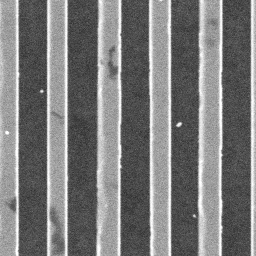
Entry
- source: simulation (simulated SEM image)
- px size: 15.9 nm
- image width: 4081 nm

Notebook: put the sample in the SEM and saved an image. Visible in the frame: lines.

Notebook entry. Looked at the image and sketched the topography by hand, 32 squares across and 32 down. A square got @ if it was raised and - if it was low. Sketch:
@@----@@----@@@----@@----@@@---@
@@----@@-----@@----@@----@@@---@
@@----@@----@@@----@@----@@@---@
@@----@@----@@@----@@----@@@---@
@@----@@----@@@----@@----@@@---@
@@----@@----@@@----@@----@@@---@
@@----@@----@@@----@@----@@@---@
@@----@@----@@@----@@----@@@---@
@@----@@----@@@----@@----@@@---@
@@----@@----@@@----@@----@@@---@
@@----@@----@@@----@@----@@@---@
@@----@@----@@@----@@----@@@---@
@@----@@----@@@----@@----@@@---@
@@----@@----@@@----@@----@@@---@
@@----@@----@@@----@@----@@@---@
@@----@@----@@@----@@----@@@---@
@@----@@----@@@----@@----@@@---@
@@----@@----@@@----@@----@@@---@
@@----@@----@@@----@@----@@@---@
@@----@@----@@@----@@----@@@---@
@@----@@----@@@----@@----@@@---@
@@----@@----@@@----@@----@@@---@
@@----@@----@@@----@@----@@@---@
@@----@@----@@@----@@----@@@---@
@@----@@----@@@----@@----@@@---@
@@----@@-----@@----@@----@@@---@
@@----@@----@@@----@@----@@@---@
@@----@@----@@@----@@----@@@---@
@@----@@----@@@----@@----@@@---@
@@----@@----@@@----@@----@@@---@
@@----@@----@@@----@@----@@@---@
@@----@@----@@@----@@----@@@---@